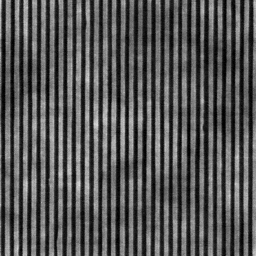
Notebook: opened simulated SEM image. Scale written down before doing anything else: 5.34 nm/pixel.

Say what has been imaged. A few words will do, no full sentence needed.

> parallel lines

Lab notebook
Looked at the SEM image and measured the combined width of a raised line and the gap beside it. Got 0.0472 microns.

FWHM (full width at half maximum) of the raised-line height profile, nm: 24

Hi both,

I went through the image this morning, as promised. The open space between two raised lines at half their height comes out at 0.024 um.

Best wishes